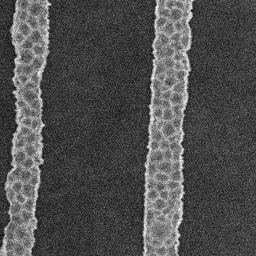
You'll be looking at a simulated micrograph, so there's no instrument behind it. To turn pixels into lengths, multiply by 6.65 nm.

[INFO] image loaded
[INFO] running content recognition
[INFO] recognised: one or a few lines or trenches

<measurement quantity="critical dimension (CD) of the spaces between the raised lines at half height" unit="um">0.726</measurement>